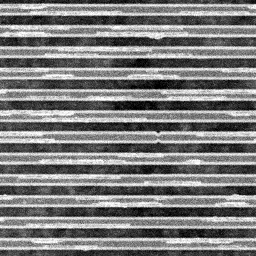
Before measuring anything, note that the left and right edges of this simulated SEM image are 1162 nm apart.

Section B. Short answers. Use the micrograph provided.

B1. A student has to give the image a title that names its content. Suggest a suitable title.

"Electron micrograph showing parallel lines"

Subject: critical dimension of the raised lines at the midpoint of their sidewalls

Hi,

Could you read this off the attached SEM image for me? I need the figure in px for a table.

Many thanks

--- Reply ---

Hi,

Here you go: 9.49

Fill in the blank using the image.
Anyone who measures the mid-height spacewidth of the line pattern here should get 51.6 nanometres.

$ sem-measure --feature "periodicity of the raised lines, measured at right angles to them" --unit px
21.3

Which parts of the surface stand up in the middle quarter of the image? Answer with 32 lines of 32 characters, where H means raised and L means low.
LLLLLLLLLLLLLLLLLLLLLLLLLLLLLLLL
HHHHHHHHHHHHHHHHHHHHHHHHHHLLLLLL
HHHHHHHHHHHHHHHHHHHHHHHHHHHHHHHH
HLLLLLLLLLLLLLLLLLLLLLLLHHHHHLLL
LLLLLLLLLLLLLLLLLLLLLLLLLLLLLLLL
LLLLLLLLLLLLLLLLLLLLLLLLLLLLLLLL
LLLLLLLLLLLLLLLLLLLLLLLLLLLLLLLL
HHHHHHHHHHHHHHHHHHHHHHHHHHHHHHHH
HHHHHHHHHHHHHHHHHHHHHHHHHHHHHHHH
LLLLLLLLLLLLLLLLLLLLLLLLLLLLLLLL
LLLLLLLLLLLLLLLLLLLLLLLLLLLLLLLL
LLLLLLLLLLLLLLLLLLLLLLLLLLLLLLLL
HHHHHHHHHHHHHHHHHHHHHHHHHHHHHHHH
HHHHHHHHHHHHHHHHHHHHHHHHHHHHHHHH
LLLLLLLLLLLLLLLLLLLLLLLLLLLLLLLL
LLLLLLLLLLLLLLLLLLLLLLLLLLLLLLLL
LLLLLLLLLLLLLLLLLLLLLLLLLLLLLLLL
HHHHHHHHHHHHHHHHHHHHHHHLHHHHHHHH
HHHHHHHHHHHHHHHHHHHHHHHHHHHHHHHH
LLLLLLLLLLLLLLLLLLLLLLLLLLLLLLLL
LLLLLLLLLLLLLLLLLLLLLLLLLLLLLLLL
LLLLLLLLLLLLLLLLLLLLLLLLLLLLLLLL
LLLLLLLLLLLLLLLHLLHHLLLLLLLLLLLL
HHHHHHHHHHHHHHHHHHHHHHHHHHHHHHHH
HHHHHHHHHHHHHHHHHHHHHHHHHHHHHHHH
LLLLLLLLLLLLLLLLLLLLLLLLLLLLLLLL
LLLLLLLLLLLLLLLLLLLLLLLLLLLLLLLL
LLLLLLLLLLLLLLLLLLLLLLLLLLLLLLLL
HHHHHHHHHHHHHHHHHHHHHHHHHHHHHHHH
HHHHHHHHHHHHHHHHHHHHHHHHHHHHHHHH
LLLLLLLLLLLLLLLLLLLLLLLLLLLLLLLL
LLLLLLLLLLLLLLLLLLLLLLLLLLLLLLLL